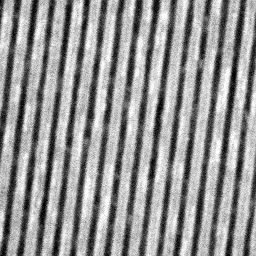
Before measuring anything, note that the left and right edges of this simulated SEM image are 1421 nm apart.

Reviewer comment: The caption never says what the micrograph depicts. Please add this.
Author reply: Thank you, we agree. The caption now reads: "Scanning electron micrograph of parallel lines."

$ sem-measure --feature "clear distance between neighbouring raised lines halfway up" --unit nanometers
51.6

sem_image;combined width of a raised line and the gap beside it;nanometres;95.4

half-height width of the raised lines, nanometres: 42